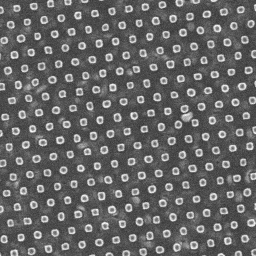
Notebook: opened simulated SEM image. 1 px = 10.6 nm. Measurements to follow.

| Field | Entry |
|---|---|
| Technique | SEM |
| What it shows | a regular array of raised bodies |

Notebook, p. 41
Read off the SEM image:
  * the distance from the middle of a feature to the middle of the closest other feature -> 180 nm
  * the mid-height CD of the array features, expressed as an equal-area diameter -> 73.9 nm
